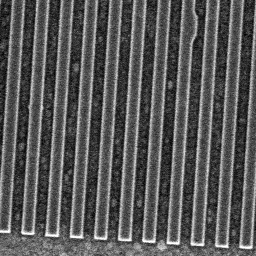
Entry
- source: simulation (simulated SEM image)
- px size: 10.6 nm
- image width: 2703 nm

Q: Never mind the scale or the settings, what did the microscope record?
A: parallel lines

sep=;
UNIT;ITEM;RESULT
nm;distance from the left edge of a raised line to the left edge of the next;256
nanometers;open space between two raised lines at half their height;134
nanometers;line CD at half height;125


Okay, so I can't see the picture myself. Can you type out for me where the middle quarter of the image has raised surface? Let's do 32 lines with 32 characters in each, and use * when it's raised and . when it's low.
*...***....**...***....**....***
*...***...***...***....**....**.
*...***...***...***....**....**.
*...***...***...***...***....**.
*...***...***...***...***....**.
*...***...***...***...***...***.
*...***...***...***...***...***.
*...***...***...***...***...***.
*...***...***...***...***...***.
*...***...***...***...***...***.
*...**....***...***...***...***.
*...**....***...***...***...***.
....**....***...**....***...***.
....**....**....**....***...***.
...***....**....**....**....***.
...***....**...***....**....***.
...***....**...***....**....***.
...***...***...***....**....**..
...***...***...***...***....**..
...***...***...***...***....**..
...***...***...***...***....**..
...***...***...***...***...***..
...***...***...***...***...***..
...***...***...***...***...***..
...***...***...***...***...***..
...***...***...***...***...***..
...**....***...***...***...***..
...**....***...***...***...***..
...**....**....***...***...***..
...**....**....***...***...***..
..***....**....**....**....***..
..***....**...***....**....***..